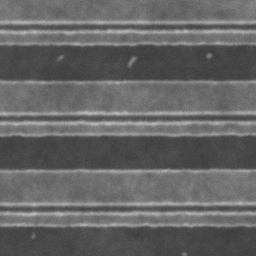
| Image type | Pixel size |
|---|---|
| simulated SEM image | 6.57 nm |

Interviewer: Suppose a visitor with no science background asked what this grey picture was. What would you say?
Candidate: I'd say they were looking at lines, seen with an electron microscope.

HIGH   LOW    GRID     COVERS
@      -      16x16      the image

@@@@@@@@@@@@@@@@
@@@@@@@@@@@@@@@@
@@@@@@@@@@@@@@@@
----------------
----------------
@@@@@@@@@@@@@@@@
@@@@@@@@@@@@@@@@
@@@@@@@@@@@@@@@@
----------------
----------------
----------------
@@@@@@@@@@@@@@@@
@@@@@@@@@@@@@@@@
@@@@@@@@@@@@@@@@
----------------
----------------